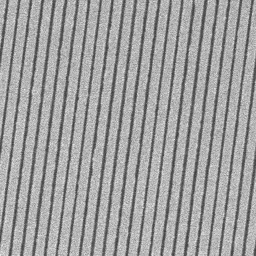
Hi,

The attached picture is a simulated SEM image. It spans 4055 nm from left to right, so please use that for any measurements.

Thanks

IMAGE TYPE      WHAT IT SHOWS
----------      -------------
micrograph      parallel lines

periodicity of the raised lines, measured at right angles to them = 0.183 µm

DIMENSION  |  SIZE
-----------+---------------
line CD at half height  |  136 nm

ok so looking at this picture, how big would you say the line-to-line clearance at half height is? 45.1 nanometres